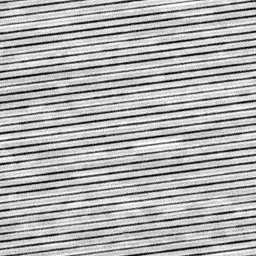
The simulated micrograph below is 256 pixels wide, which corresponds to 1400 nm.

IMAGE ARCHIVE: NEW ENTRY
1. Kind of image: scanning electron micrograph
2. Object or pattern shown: parallel lines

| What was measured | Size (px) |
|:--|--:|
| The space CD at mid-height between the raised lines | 2.47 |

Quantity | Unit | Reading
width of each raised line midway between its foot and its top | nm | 27.2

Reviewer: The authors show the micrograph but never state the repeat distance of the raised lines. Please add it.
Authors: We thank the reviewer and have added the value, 0.0418 microns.